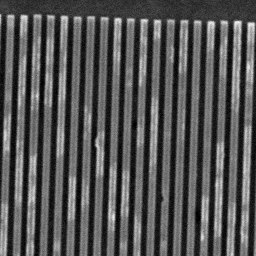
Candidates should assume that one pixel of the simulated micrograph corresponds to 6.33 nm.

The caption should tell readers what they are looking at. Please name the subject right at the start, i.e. parallel lines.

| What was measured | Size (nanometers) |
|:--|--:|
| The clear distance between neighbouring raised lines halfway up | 41.9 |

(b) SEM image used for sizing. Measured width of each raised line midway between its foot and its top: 0.0419 um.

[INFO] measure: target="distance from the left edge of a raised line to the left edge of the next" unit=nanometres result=84.6